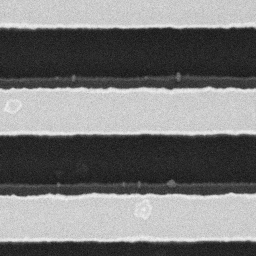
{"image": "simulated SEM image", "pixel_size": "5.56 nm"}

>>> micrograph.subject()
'lines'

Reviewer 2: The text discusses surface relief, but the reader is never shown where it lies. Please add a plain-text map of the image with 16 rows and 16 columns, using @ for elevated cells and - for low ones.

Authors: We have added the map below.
@@@@@@@@@@@@@@@@
@@@@@@@@@@@@@@@@
----------------
----------------
----------------
----@@--@@--@@@-
@@@@@@@@@@@@@@@@
@@@@@@@@@@@@@@@@
----------------
----------------
----------------
----------------
@@@@@@@@@@@@@@@@
@@@@@@@@@@@@@@@@
@@@@@@@@@@@@@@@@
----------------